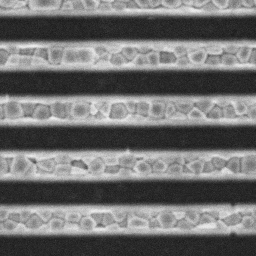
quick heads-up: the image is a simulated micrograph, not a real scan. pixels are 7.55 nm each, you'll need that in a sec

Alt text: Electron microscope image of parallel lines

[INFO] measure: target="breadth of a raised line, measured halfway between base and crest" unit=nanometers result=184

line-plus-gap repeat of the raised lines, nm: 414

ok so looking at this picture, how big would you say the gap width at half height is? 30.3 px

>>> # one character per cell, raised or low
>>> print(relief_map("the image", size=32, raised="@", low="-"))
@@@@@@@@@@@@@@@@@@@@@@@@@@@@@@@@
@@@@@@@@@@@@@@@@@@@@@@@@@@@@@@@@
--------------------------------
--------------------------------
--------------------------------
---@@@------@@@@@@@@@@@@@@@--@@@
@@@@@@@@@@@@@@@@@@@@@@@@@@@@@@@@
@@@@@@@@@@@@@@@@@@@@@@@@@@@@@@@@
@@@@@@@-------------------------
--------------------------------
--------------------------------
--------------------------------
@@@@@@@@@@@@@@@@@@@@@@@@@@@@@@@@
@@@@@@@@@@@@@@@@@@@@@@@@@@@@@@@@
@@@@@@@@@@@@@@@@@@@@@@@@@@@@@@@@
--------------------------------
--------------------------------
--------------------------------
--------------------------------
@@@@@@@@@@@@@@@@@@@@@@@@@@@@@@@@
@@@@@@@@@@@@@@@@@@@@@@@@@@@@@@@@
@@@@@@@@@@@@@@@@@@@@@@@@@@@@@@@@
--------------------------------
--------------------------------
--------------------------------
--------------------------------
@@@@@@@@@@@@@@@@@@@@@@@@@@@@@@@@
@@@@@@@@@@@@@@@@@@@@@@@@@@@@@@@@
@@@@@@@@@@@@@@@@@@@@@@@@@@@@@@@@
--------------------------------
--------------------------------
--------------------------------